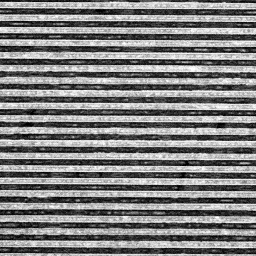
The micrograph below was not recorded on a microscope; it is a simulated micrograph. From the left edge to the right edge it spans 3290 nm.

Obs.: parallel lines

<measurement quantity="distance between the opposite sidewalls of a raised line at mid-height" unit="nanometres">69.1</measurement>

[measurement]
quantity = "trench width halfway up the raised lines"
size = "91.5 nm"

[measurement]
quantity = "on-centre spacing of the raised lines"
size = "162 nanometres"